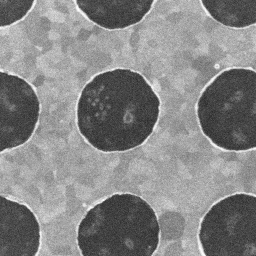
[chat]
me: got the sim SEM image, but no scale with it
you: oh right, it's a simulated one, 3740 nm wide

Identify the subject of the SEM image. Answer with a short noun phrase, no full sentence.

holes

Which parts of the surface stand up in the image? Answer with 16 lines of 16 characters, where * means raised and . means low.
..***....****...
.*****..******..
****************
****************
*******.******..
..***....****...
..***.....**....
..***.....**....
..***....****...
****************
****************
****************
.******..*****..
..***.....***...
...**.....**....
..***.....***...